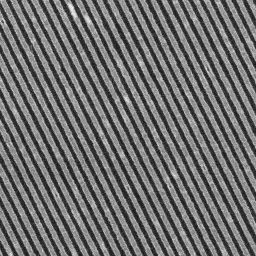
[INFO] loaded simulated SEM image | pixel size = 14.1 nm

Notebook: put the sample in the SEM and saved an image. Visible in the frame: parallel lines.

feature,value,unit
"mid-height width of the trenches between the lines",0.0677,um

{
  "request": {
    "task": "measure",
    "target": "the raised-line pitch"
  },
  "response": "135 nm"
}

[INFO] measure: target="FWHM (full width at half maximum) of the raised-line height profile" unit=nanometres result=66.1